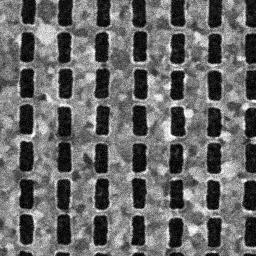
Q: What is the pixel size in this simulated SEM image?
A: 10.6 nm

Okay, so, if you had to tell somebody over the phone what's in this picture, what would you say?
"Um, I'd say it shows a regular array of holes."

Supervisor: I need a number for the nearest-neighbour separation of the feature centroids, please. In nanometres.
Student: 382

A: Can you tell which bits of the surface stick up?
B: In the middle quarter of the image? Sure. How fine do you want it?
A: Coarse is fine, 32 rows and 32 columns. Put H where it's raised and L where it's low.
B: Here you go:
HHHHHHHHHHHHHHHHHHHHHHHHHHHHHHHH
LLHHHHHHLLLHHHHHHHLLLHHHHHHHLLHH
LLHHHHHHLLLLHHHHHLLLLHHHHHLLLLHH
LLHHHHHHLLLLHHHHHLLLLHHHHHHLLLHH
LLHHHHHHLLLLHHHHHLLLLHHHHHHLLLHH
LLHHHHHHLLLHHHHHHLLLLHHHHHLLLLHH
LLHHHHHHLLLHHHHHHLLLLHHHHHLLLLHH
LLHHHHHLLLLHHHHHHLLLLHHHHHLLLLHH
LLHHHHHHLLLHHHHHHHLLLHHHHHHLLLHH
HHHHHHHHHHHHHHHHHHHHHHHHHHHHHHHH
HHHHHHHHLLLHHHHHHLLLHHHHHHHLHHHH
LLHHHHHHLLLLHHHHHLLLLHHHHHLLLLHH
LLHHHHHHLLLHHHHHHLLLLHHHHHHLLLHH
LLHHHHHHLLLHHHHHHLLLLHHHHHHLLLLH
LLHHHHHHLLLHHHHHHLLLLHHHHHHLLLLH
LLHHHHHHLLLHHHHHHLLLLHHHHHLLLLHH
LLHHHHHHLLLLHHHHHLLLLHHHHHLLLLHH
LLHHHHHHLLLHHHHHHLLLLHHHHHHLLLHH
HHHHHHHHHHHHHHHHHHHHHHHHHHHHHHHH
HHHHHHHHHHHHHHHHHHHHHHHHHHHHHHHH
LLHHHHHHLLLHHHHHHLLLLHHHHHLLLLHH
LLHHHHHLLLLHHHHHHLLLLHHHHHLLLLHH
LLHHHHHLLLLHHHHHHLLLLHHHHHLLLLHH
LLHHHHHLLLLHHHHHHLLLLHHHHHLLLLHH
LLHHHHHHLLLHHHHHHLLLLHHHHHLLLLHH
LLHHHHHLLLLHHHHHHLLLLHHHHHLLLLHH
LLHHHHHHLLLHHHHHHLLLLHHHHHLLLLHH
HHHHHHHHHLHHHHHHHHHHHHHHHHHLLHHH
HHHHHHHHHLLHHHHHHLLHHHHHHHHHHHHH
LLHHHHHHLLLHHHHHHLLLLHHHHHHLLLHH
LLHHHHHHLLLHHHHHHLLLLHHHHHLLLLHH
LLHHHHHHLLLHHHHHHLLLLHHHHHLLLLHH